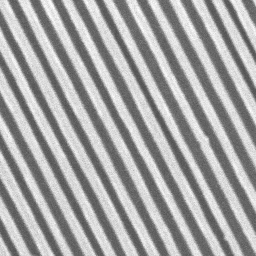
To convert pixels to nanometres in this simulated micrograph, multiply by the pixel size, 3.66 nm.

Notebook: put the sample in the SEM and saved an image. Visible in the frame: parallel lines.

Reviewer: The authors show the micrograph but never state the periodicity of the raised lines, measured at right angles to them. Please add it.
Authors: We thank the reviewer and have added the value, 0.0701 micrometres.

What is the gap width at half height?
33 nm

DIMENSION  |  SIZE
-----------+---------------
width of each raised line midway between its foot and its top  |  9.78 pixels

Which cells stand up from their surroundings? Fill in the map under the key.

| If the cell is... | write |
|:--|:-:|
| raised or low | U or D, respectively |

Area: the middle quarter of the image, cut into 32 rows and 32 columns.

DDUUUDDDUUUDDUUUDDUUUDDDUUDDDUUU
DDDUUUDDUUUDDDUUUDDUUDDDUUUDDDUU
UDDUUUDDDUUDDDUUUDDUUUDDDUUDDDUU
UDDDUUUDDUUUDDDUUUDDUUDDDUUUDDDU
UUDDUUUDDDUUDDDUUUDDUUUDDDUUDDDU
UUDDDUUUDDUUUDDDUUUDDUUDDDUUUDDD
UUUDDDUUDDDUUDDDUUUDDUUUDDDUUDDD
UUUDDDUUUDDUUUDDDUUUDDUUDDDUUUDD
DUUUDDDUUDDDUUDDDUUUDDUUUDDDUUDD
DUUUDDDUUUDDUUUDDDUUUDDUUDDDUUUD
DDUUUDDDUUDDDUUDDDUUUDDUUUDDDUUD
DDUUUDDDUUUDDUUUDDDUUUDDUUDDDUUU
DDDUUUDDDUUDDDUUDDDUUUDDUUUDDDUU
UDDUUUDDDUUUDDUUUDDDUUUDDUUDDDUU
UDDDUUUDDDUUDDDUUUDDUUUDDUUUDDDU
UUDDUUUDDDUUUDDUUUDDDUUUDDUUDDDU
UUDDDUUUDDDUUUDDUUUDDUUUDDUUUDDD
UUUDDUUUUDDUUUDDDUUDDDUUUDDUUDDD
UUUUDDUUUDDDUUDDDUUUDDUUUDDUUUDD
DUUUDDUUUDDDUUUDDDUUDDDUUUDDUUDD
DUUUUDDUUUDDDUUUDDUUDDDUUUDDDUUD
DDUUUDDUUUDDDUUUDDDUUDDDUUUDDUUD
DDUUUUDDUUUDDDUUUDDUUDDDUUUDDDUU
UDDUUUDDUUUDDDUUUDDDUUDDDUUUDDUU
UDDUUUUDDUUUDDDUUUDDUUUDDDUUDDDU
UUDDUUUDDUUUDDDDUUDDDUUDDDUUUDDU
UUDDDUUUDDUUUDDDUUUDDUUUDDDUUDDD
UUUDDUUUDDDUUDDDDUUDDDUUDDDUUUDD
UUUDDDUUUDDUUUDDDUUDDDUUUDDDUUDD
DUUUDDUUUDDDUUDDDUUUDDDUUDDDUUUD
DUUUDDDUUUDDUUUDDDUUDDDUUUDDUUUD
DDUUUDDDUUDDDUUDDDUUUDDDUUDDDUUU